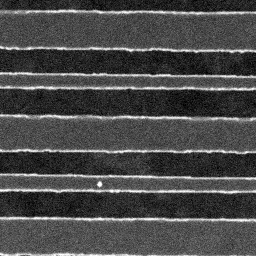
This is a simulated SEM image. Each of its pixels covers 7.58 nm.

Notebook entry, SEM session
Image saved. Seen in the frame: lines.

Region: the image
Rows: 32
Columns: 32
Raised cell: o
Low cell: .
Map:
................................
ooooooooooooooooooooo...........
oooooooooooooooooooooooooooooooo
oooooooooooooooooooooooooooooooo
oooooooooooooooooooooooooooooooo
oooooooooooooooooooooooooooooooo
................................
................................
................................
oooooooooooooooooooooooooooooo..
oooooooooooooooooooooooooooooooo
................................
................................
................................
oooo.oo.........................
oooooooooooooooooooooooooooooooo
oooooooooooooooooooooooooooooooo
oooooooooooooooooooooooooooooooo
oooooooooooooooooooooooooooooooo
................................
................................
................................
oooooooooooooooooooooooooooooooo
oooooooooooooooooooooooooooooooo
................................
................................
................................
oooooooooooooooooooooooooooooooo
oooooooooooooooooooooooooooooooo
oooooooooooooooooooooooooooooooo
oooooooooooooooooooooooooooooooo
oooooooooooooooooooooooooooooooo